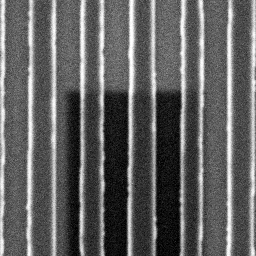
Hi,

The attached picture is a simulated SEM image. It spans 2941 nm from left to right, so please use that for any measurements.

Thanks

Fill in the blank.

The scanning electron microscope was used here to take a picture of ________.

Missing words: lines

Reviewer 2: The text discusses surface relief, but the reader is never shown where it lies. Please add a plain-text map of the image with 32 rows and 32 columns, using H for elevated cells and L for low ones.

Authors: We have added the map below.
LLLLHHHLLLHHHLLLHHHLLLLHHLLLLHHH
LLLLHHHLLLHHHLLLHHHLLLLHHLLLLHHH
LLLLHHHLLLHHHLLLHHHLLLLHHLLLLHHH
LLLLHHHLLLHHHLLLHHHLLLLHHLLLLHHH
LLLLHHHLLLHHHLLLHHHLLLLHHLLLLHHH
LLLLHHHLLLHHHLLLHHHLLLLHHLLLLHHH
LLLLHHHLLLHHHLLLHHHLLLLHHLLLLHHH
LLLLHHHLLLHHHLLLHHHLLLLHHLLLLHHH
LLLLHHHLLLHHHLLLHHHLLLLHHLLLLHHH
LLLLHHHLLLHHHLLLHHHLLLLHHLLLLHHH
LLLLHHHLLLHHHLLLHHHLLLLHHLLLLHHH
LLLLHHHLLLHHHLLLHHHLLLLHHLLLLHHH
LLLLHHHLLLHHHLLLHHHLLLLHHLLLLHHH
LLLLHHHLLLHHHLLLHHHLLLLHHLLLLHHH
LLLLHHHLLLHHHLLLHHHLLLLHHLLLLHHH
LLLLHHHLLLHHHLLLHHHLLLLHHLLLLHHH
LLLLHHHLLLHHHLLLHHHLLLLHHLLLLHHH
LLLLHHHLLLHHHLLLHHHLLLLHHLLLLHHH
LLLLHHHLLLHHHLLLHHHLLLLHHLLLLHHH
LLLLHHHLLLHHHLLLHHHLLLLHHLLLLHHH
LLLLHHHLLLHHHLLLHHHLLLLHHLLLLHHH
LLLLHHHLLLHHHLLLHHHLLLLHHLLLLHHH
LLLLHHHLLLHHHLLLHHHLLLLHHLLLLHHH
LLLLHHHLLLHHHLLLHHHLLLLHHLLLLHHH
LLLLHHHLLLHHHLLLHHHLLLLHHLLLLHHH
LLLLHHHLLLHHHLLLHHHLLLLHHLLLLHHH
LLLLHHHLLLHHHLLLHHHLLLLHHLLLLHHH
LLLLHHHLLLHHHLLLHHHLLLLHHLLLLHHH
LLLLHHHLLLHHHLLLHHHLLLLHHLLLLHHH
LLLLHHHLLLHHHLLLHHHLLLLHHLLLLHHH
LLLLHHHLLLHHHLLLHHHLLLLHHLLLHHHH
LLLLHHHLLLHHHLLLHHHLLLLHHLLLHHHH